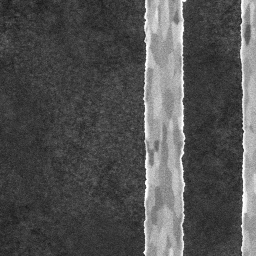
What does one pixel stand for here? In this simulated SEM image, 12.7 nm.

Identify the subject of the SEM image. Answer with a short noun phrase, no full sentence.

one or a few lines or trenches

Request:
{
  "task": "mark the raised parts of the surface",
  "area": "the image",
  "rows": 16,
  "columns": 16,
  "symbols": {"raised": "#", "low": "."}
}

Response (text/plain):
.........##....#
.........##....#
.........##....#
.........##....#
.........##....#
.........##....#
.........##....#
.........##....#
.........##....#
.........##....#
.........##....#
.........##....#
.........##....#
.........##....#
.........##....#
.........##....#